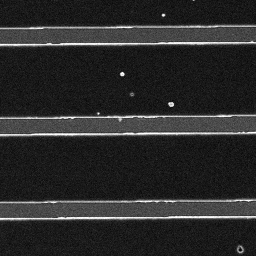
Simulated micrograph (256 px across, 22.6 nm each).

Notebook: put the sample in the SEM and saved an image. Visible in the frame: lines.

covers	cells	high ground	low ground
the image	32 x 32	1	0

11111111111111111111111111111111
11111111111111111111111111111111
11111111111111111111111111111111
11111100000000000000000000000000
00000000000000000000000000000000
00000000111111111111111111111111
11111111111111111111111111111111
11111111111111111111111111111111
11111111111111111111111111111111
11111111111111111111111111111111
11111111111111111111111111111111
11111111111111111111111111111111
11111111111111111111111111111111
11111111111111111111111111111111
11111111111111111111111111111000
00000000000000000000000000000000
00000000000000000000000000000000
11111111111111111111111111111111
11111111111111111111111111111111
11111111111111111111111111111111
11111111111111111111111111111111
11111111111111111111111111111111
11111111111111111111111111111111
11111111111111111111111111111111
11111111111111111111111111111111
00000000000000000000000000000000
00000000000000000000000000000000
11111111111111111111111111111111
11111111111111111111111111111111
11111111111111111111111111111111
11111111111111111111111111111111
11111111111111111111111111111111